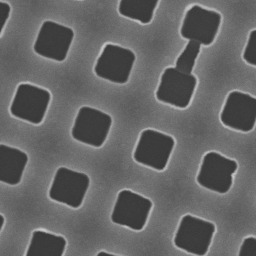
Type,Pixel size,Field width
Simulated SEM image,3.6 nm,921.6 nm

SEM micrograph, a regular array of holes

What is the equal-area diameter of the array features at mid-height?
132 nm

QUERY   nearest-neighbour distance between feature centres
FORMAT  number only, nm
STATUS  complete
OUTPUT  235